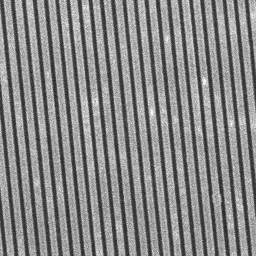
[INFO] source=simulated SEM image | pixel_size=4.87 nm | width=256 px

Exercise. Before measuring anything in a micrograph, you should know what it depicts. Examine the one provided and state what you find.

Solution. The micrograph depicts parallel lines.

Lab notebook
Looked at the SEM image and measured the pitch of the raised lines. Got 0.054 micrometres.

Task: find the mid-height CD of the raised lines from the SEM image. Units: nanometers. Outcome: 33.9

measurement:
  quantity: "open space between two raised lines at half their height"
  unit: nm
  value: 21.2